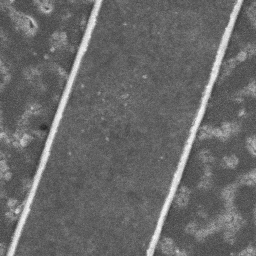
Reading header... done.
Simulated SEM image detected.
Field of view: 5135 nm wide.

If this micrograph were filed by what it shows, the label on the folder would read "one or a few lines or trenches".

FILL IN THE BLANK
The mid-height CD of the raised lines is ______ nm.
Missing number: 2650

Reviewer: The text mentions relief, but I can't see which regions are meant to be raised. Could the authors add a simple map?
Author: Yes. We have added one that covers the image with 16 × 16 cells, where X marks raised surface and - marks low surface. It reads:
------XXXXXXXXX-
------XXXXXXXX--
-----XXXXXXXXX--
-----XXXXXXXXX--
-----XXXXXXXX---
----XXXXXXXXX---
----XXXXXXXXX---
----XXXXXXXX----
---XXXXXXXXX----
---XXXXXXXXX----
---XXXXXXXX-----
--XXXXXXXXX-----
--XXXXXXXXX-----
--XXXXXXXX------
-XXXXXXXXX------
-XXXXXXXX-------